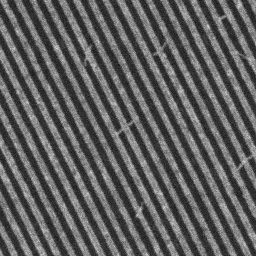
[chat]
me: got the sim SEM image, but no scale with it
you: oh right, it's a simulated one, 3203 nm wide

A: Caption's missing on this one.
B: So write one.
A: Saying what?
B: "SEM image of parallel lines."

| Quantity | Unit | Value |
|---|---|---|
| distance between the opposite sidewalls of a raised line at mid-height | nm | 65.7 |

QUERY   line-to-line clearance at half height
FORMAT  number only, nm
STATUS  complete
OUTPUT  99.3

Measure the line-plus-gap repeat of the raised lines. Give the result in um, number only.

0.163